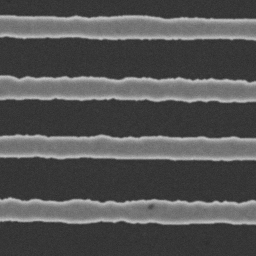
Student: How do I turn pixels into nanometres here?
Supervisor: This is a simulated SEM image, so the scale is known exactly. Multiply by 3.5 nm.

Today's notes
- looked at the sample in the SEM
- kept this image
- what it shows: lines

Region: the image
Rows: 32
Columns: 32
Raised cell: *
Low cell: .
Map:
................................
................................
********************************
********************************
********************************
................................
................................
................................
................................
................................
********************************
********************************
..........*.....**.*************
................................
................................
................................
................................
********************************
********************************
********************************
................................
................................
................................
................................
................................
********************************
********************************
********************************
................................
................................
................................
................................